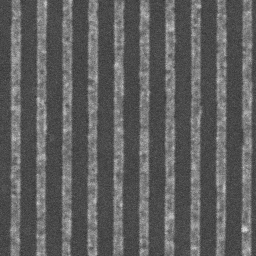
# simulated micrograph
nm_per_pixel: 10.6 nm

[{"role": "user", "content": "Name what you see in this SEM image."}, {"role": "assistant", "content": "parallel lines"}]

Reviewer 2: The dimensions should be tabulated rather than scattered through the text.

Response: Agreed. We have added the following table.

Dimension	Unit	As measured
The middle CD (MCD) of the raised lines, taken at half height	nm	79.3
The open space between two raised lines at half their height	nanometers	196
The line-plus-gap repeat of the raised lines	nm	272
